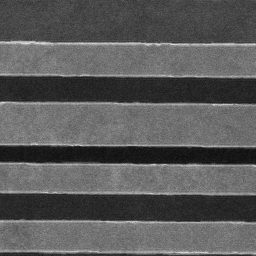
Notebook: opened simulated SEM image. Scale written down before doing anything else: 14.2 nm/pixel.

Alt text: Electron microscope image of lines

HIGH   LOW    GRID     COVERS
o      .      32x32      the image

................................
................................
................................
................................
................................
oooooo..o..o....................
oooooooooooooooooooooooooooooooo
oooooooooooooooooooooooooooooooo
oooooooooooooooooooooooooooooooo
.....................ooooooooooo
................................
................................
................................
oooooooooooooooooooooooooooooooo
oooooooooooooooooooooooooooooooo
oooooooooooooooooooooooooooooooo
oooooooooooooooooooooooooooooooo
oooooooooooooooooooooooooooooooo
................................
................................
ooooooo.oo......................
oooooooooooooooooooooooooooooooo
oooooooooooooooooooooooooooooooo
oooooooooooooooooooooooooooooooo
................................
................................
................................
................................
oooooooooooooooooooooooooooooooo
oooooooooooooooooooooooooooooooo
oooooooooooooooooooooooooooooooo
..................oooooooooooooo